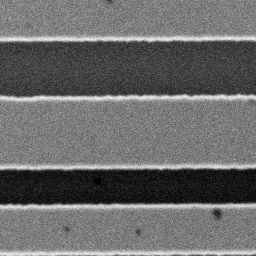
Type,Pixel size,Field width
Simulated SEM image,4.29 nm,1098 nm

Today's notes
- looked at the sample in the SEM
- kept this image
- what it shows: lines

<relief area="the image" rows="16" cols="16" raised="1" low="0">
1111111111111111
1111111111111111
1111111111111001
0000000000000000
0000000000000000
0000000000000000
1111111111111111
1111111111111111
1111111111111111
1111111111111111
1111111111111111
0000000000000000
0000000000000000
1111111111111111
1111111111111111
1111111111111111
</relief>